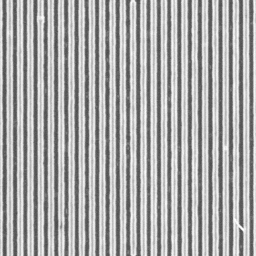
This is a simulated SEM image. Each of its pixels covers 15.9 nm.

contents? parallel lines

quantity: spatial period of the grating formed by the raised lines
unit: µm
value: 0.163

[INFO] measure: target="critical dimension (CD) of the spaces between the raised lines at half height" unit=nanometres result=85.5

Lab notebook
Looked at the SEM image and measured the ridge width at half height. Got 71.6 nm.